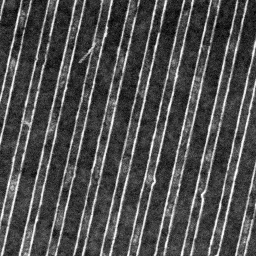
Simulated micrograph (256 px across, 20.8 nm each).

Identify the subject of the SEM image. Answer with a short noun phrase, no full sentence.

parallel lines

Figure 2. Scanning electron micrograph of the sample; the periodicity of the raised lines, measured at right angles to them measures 0.547 microns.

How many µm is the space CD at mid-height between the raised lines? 0.349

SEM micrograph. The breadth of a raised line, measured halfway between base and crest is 0.185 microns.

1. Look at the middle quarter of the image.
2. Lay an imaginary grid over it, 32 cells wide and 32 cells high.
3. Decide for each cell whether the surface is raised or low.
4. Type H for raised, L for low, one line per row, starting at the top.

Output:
HHLLLLHHLLLLLHHLLLLLHHLLLLHHHLLL
HLLLLLHHLLLLLHHLLLLHHHLLLLHHLLLL
HLLLLLHHLLLLHHHLLLLHHLLLLLHHLLLL
HLLLLHHHLLLLHHLLLLLHHLLLLLHHLLLL
HLLLLHHHLLLLHHLLLLLHHLLLLHHHLLLL
HLLLLHHLLLLLHHLLLLLHHLLLLHHHLLLL
LLLLLHHLLLLLHHLLLLHHHLLLLHHLLLLL
LLLLLHHLLLLHHHLLLLHHLLLLLHHLLLLL
LLLLLHLLLLLHHLLLLLHHLLLLLHHLLLLH
LLLLHHLLLLLHHLLLLLHHLLLLHHHLLLLH
LLLLHHLLLLLHHLLLLHHHLLLLHHLLLLLH
LLLLHHLLLLHHHLLLLHHLLLLLHHLLLLLH
LLLHHHLLLLHHLLLLLHHLLLLLHHLLLLHH
LLLHHHLLLLHHLLLLLHHLLLLHHHLLLLHH
LLLHHLLLLLHHLLLLHHHLLLLHHHLLLLHH
LLLHHLLLLLHHLLLLHHHLLLLHHLLLLLHH
LLLHHLLLLHHHLLLLHHLLLLLHHLLLLLHH
LLHHHLLLLHHLLLLLHHLLLLLHHLLLLHHH
LLHHHLLLLHHLLLLLHHLLLLHHHLLLLHHL
LLHHLLLLLHHLLLLLHHLLLLHHHLLLLHHL
LLHHLLLLHHHLLLLHHHLLLLHHLLLLLHHL
LHHHLLLLHHLLLLLHHLLLLLHHLLLLLHHL
LHHHLLLLHHLLLLLHHLLLLLHHLLLLHHLL
LHHLLLLLHHLLLLHHHLLLLHHHLLLLHHLL
LHHLLLLLHHLLLLHHHLLLLHHLLLLLHHLL
LHHLLLLHHHLLLLHHLLLLLHHLLLLLHHLL
HHHLLLLHHLLLLLHHLLLLLHHLLLLHHHLL
HHHLLLLHHLLLLLHHLLLLLHHLLLLHHLLL
HHLLLLLHHLLLLHHHLLLLHHHLLLLHHLLL
HHLLLLLHHLLLLHHHLLLLHHHLLLLHHLLL
HHLLLLHHLLLLLHHLLLLLHHLLLLLHHLLL
HHLLLLHHLLLLLHHLLLLHHHLLLLHHHLLL